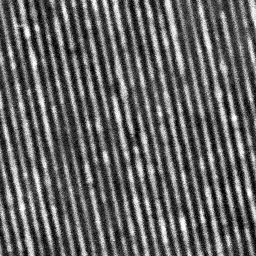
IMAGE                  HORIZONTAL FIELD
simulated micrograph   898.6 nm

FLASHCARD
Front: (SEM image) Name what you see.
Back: parallel lines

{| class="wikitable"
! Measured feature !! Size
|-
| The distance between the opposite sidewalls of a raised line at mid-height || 0.0103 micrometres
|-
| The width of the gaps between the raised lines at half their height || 24.5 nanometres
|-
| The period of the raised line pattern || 10.3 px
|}